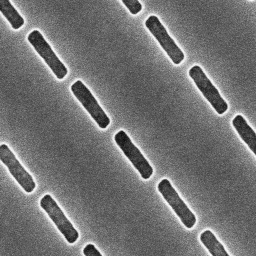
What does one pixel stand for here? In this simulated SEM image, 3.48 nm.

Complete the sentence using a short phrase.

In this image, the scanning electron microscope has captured holes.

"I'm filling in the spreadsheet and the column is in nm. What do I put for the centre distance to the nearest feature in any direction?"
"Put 230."